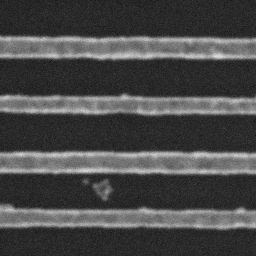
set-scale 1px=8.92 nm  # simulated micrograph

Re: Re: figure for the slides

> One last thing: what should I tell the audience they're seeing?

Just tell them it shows lines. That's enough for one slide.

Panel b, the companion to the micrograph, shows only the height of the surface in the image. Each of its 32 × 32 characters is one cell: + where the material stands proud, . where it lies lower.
................................
................................
................................
................................
................................
++++++++++++++++++++++++++++++++
++++++++++++++++++++++++++++++++
................................
................................
................................
................................
................................
++++++++++++++++++++++++++++++++
++++++++++++++++++++++++++++++++
................................
................................
................................
................................
................................
++++++++++++++++++++++++++++++++
++++++++++++++++++++++++++++++++
++..+++++++...++++++++++++++++++
................................
................................
................................
................................
++++++++++++++++++++++++++++++++
++++++++++++++++++++++++++++++++
...........................++...
................................
................................
................................